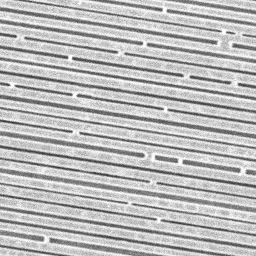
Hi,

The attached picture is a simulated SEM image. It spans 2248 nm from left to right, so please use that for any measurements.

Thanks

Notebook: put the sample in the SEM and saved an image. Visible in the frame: parallel lines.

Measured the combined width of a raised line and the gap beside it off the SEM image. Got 108 nm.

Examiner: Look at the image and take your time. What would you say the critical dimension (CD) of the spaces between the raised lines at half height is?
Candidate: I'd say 0.038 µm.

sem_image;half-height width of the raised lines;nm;69.4